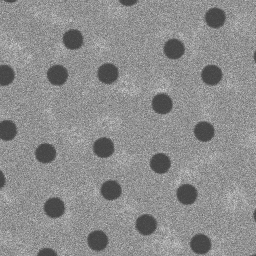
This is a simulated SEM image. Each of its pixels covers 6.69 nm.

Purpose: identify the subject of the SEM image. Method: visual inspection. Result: a regular array of holes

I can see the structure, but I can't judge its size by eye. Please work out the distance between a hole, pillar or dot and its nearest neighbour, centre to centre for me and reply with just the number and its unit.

0.326 µm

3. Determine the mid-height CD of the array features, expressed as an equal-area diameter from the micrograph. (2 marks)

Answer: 138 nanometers